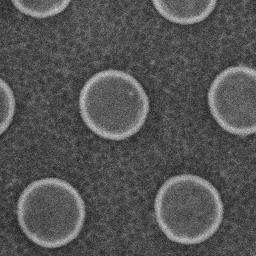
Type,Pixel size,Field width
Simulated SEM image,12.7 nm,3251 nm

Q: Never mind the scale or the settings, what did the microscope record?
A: raised bodies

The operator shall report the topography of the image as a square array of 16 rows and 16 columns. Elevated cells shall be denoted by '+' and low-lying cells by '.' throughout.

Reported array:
.+++......+++...
................
................
................
..............++
.....++++....+++
+....++++....+++
+....++++.....++
.......+........
................
................
..++......+++...
.++++.....++++..
.++++.....++++..
..+++.....+++...
................